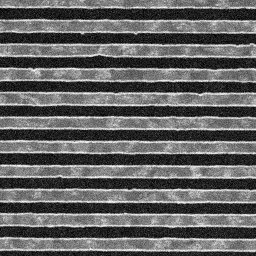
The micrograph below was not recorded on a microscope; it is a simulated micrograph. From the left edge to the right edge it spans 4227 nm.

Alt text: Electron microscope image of parallel lines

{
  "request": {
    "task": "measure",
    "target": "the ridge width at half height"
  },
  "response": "0.19 microns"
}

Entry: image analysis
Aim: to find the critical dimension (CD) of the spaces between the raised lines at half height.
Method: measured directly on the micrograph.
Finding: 204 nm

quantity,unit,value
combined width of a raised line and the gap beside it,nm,400